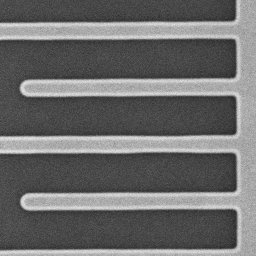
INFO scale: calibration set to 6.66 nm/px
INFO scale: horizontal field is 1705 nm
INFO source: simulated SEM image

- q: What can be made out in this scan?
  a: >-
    groups of lines, slits or small figures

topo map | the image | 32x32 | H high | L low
LLLLLLLLLLLLLLLLLLLLLLLLLLLLLLHH
LLLLLLLLLLLLLLLLLLLLLLLLLLLLLLHH
LLLLLLLLLLLLLLLLLLLLLLLLLLLLLLHH
HHHHHHHHHHHHHHHHHHHHHHHHHHHHHHHH
HHHHHHHHHHHHHHHHHHHHHHHHHHHHHHHH
LLLLLLLLLLLLLLLLLLLLLLLLLLLLLLHH
LLLLLLLLLLLLLLLLLLLLLLLLLLLLLLHH
LLLLLLLLLLLLLLLLLLLLLLLLLLLLLLHH
LLLLLLLLLLLLLLLLLLLLLLLLLLLLLLHH
LLLLLLLLLLLLLLLLLLLLLLLLLLLLLLHH
LLLHHHHHHHHHHHHHHHHHHHHHHHHHHHHH
LLLHHHHHHHHHHHHHHHHHHHHHHHHHHHHH
LLLLLLLLLLLLLLLLLLLLLLLLLLLLLLHH
LLLLLLLLLLLLLLLLLLLLLLLLLLLLLLHH
LLLLLLLLLLLLLLLLLLLLLLLLLLLLLLHH
LLLLLLLLLLLLLLLLLLLLLLLLLLLLLLHH
LLLLLLLLLLLLLLLLLLLLLLLLLLLLLLHH
HHHHHHHHHHHHHHHHHHHHHHHHHHHHHHHH
HHHHHHHHHHHHHHHHHHHHHHHHHHHHHHHH
LLLLLLLLLLLLLLLLLLLLLLLLLLLLLLHH
LLLLLLLLLLLLLLLLLLLLLLLLLLLLLLHH
LLLLLLLLLLLLLLLLLLLLLLLLLLLLLLHH
LLLLLLLLLLLLLLLLLLLLLLLLLLLLLLHH
LLLLLLLLLLLLLLLLLLLLLLLLLLLLLLHH
LLLHHHHHHHHHHHHHHHHHHHHHHHHHHHHH
LLLHHHHHHHHHHHHHHHHHHHHHHHHHHHHH
LLLLLLLLLLLLLLLLLLLLLLLLLLLLLLHH
LLLLLLLLLLLLLLLLLLLLLLLLLLLLLLHH
LLLLLLLLLLLLLLLLLLLLLLLLLLLLLLHH
LLLLLLLLLLLLLLLLLLLLLLLLLLLLLLHH
LLLLLLLLLLLLLLLLLLLLLLLLLLLLLLHH
LLLLLLLLHHHHHHHHHHHHHHHHHHHHHHHH